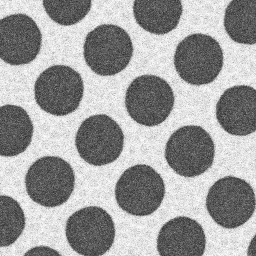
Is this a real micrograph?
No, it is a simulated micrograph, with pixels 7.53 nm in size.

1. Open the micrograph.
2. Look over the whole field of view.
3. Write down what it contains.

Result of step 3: a regular array of holes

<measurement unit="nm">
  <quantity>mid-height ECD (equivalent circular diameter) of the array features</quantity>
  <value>381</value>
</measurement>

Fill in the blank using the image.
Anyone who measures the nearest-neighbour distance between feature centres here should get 480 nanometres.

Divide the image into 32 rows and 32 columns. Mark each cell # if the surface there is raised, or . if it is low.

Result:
#####......######......######...
######.....######......#####....
....###...#######.....######....
.....#######...###....######....
.....######.....########..###...
.....#####.......#####.....####.
.....#####.......#####......####
....#######.....######......####
######...##.....######......####
#####.....########.###.....#####
####......######.....###..######
####......######......######....
####......######......#####.....
...##.....######......#####.....
....########.###.....######.....
....######.....###..#######.....
....######.....#######....##....
....#####......######......#####
...#######.....######......#####
..########.....######......#####
####.....##..########......#####
###......#######....##....######
###......######.....#######...##
###......#####.......#####.....#
.###.....#####.......#####......
..###...#######.....######......
...######....###...#######......
...#####......#######...###....#
...#####......######.....###.###
..######......######......######
.########.....######......#####.
###....###...#######.....######.